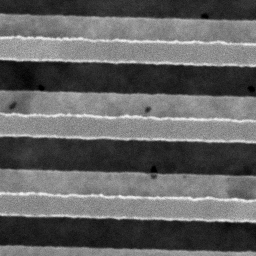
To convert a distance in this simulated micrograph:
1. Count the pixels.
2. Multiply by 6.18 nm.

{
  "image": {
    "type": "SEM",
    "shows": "lines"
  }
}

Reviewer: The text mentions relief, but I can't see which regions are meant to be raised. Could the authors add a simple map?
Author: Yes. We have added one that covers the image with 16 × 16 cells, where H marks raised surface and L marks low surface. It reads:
LLLLLLLLLLLLLLLL
HHHHHHHHHHHHHHHH
HHHHHHHHHHHHHHHH
HHHHHHHHHHHHHHHH
LLLLLLLLLLLLLLLL
LLLLLLLLLLLLLLLL
HHHHHHHHHHHHHHHH
HHHHHHHHHHHHHHHH
LLHHHHHHHHHHHHHH
LLLLLLLLLLLLLLLL
LLLLLLLLLLLLLLLL
HHHHHHHHHHHHHHHH
HHHHHHHHHHHHHHHH
LHHHHHHHHHHHHHHH
LLLLLLLLLLLLLLLL
HHHHLLLLLLLLLLLL